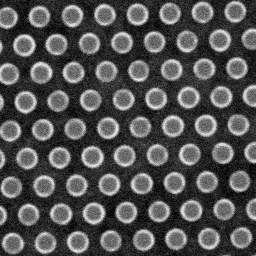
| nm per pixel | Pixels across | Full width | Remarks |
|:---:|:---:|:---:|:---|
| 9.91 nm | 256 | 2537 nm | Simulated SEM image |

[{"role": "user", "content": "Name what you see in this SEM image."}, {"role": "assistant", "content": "an array of small figures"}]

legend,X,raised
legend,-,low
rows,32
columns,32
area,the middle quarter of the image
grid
XXXX----XXXXX---XXXXX---XXXXX---
XXXXX---XXXXX---XXXXX---XXXXXX--
XXXXX---XXXXX---XXXXX----XXXX---
XXXXX---XXXXX----XXXX----XXXX---
-XXX----------------------------
--------------------------------
--------------XX-----XXX-----XXX
----XXXXX----XXXX----XXXX----XXX
X---XXXXX---XXXXX---XXXXXX---XXX
X---XXXXX---XXXXX---XXXXXX---XXX
X---XXXXX----XXXX----XXXX----XXX
------X-------------------------
--------------------------------
----------XX------XX------XXX---
-XXXX----XXXX----XXXX----XXXXX--
XXXXX---XXXXXX---XXXXX---XXXXX--
XXXXX---XXXXXX---XXXXX---XXXXX--
-XXXX----XXXX----XXXX----XXXX---
--XX------XX--------------------
--------------------------------
--------------XX------XXX-----XX
X----XXXX----XXXX----XXXXX---XXX
X----XXXXX---XXXXX---XXXXX---XXX
X---XXXXXX---XXXXX---XXXXX---XXX
X----XXXXX---XXXX----XXXX-----XX
X-----XXX-----XX----------------
--------------------------------
-------------------X------XXX---
-XXXX----XXXX----XXXXX---XXXXX--
-XXXXX---XXXXX---XXXXX---XXXXX--
-XXXXX---XXXXX---XXXXX---XXXXX--
-XXXXX---XXXXX---XXXXX----XXXX--